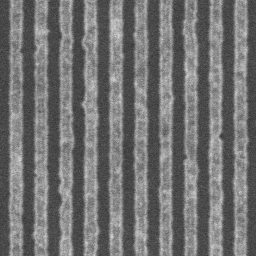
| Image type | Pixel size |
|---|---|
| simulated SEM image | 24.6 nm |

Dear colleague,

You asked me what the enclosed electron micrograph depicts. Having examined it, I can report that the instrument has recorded parallel lines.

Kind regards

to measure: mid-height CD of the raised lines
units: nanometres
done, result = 258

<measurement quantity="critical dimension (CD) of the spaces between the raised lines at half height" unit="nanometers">345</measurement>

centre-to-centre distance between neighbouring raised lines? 614 nanometers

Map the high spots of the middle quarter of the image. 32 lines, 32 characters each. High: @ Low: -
@@---@@@----@@----@@@---@@@---@@
@@---@@@----@@----@@@---@@@---@@
@@---@@@----@@----@@@---@@@----@
@@---@@@----@@----@@@---@@@---@@
@@---@@@----@@----@@@---@@@---@@
@@---@@@----@@----@@@---@@@---@@
@@----@@----@@----@@----@@@---@@
@@---@@@----@@----@@----@@@---@@
@@---@@@----@@----@@@---@@@---@@
@@---@@@----@@----@@----@@@----@
@@---@@@----@@----@@----@@@----@
@@---@@@----@@----@@@---@@@---@@
@@---@@@----@@----@@@---@@@---@@
@@----@@----@@----@@@---@@@---@@
@@----@@----@@----@@@---@@@---@@
@@----@@----@@----@@@---@@@----@
@@----@@----@@----@@@---@@@----@
@@----@@----@@----@@@---@@@---@@
@@---@@@----@@----@@@---@@@---@@
@@---@@@----@@----@@----@@@---@@
@@---@@@----@@----@@----@@@---@@
@@----@@----@@----@@----@@@----@
@@---@@@----@@----@@@---@@@----@
@@---@@@----@@----@@@---@@@----@
@@---@@@----@@----@@----@@@---@@
@@---@@@----@@----@@----@@@---@@
@@---@@@----@@----@@----@@----@@
@@---@@@----@@----@@----@@@---@@
@@---@@@----@@----@@----@@@----@
@@---@@@---@@@----@@----@@@---@@
@@---@@@----@@----@@----@@@---@@
@----@@@----@@----@@----@@@----@